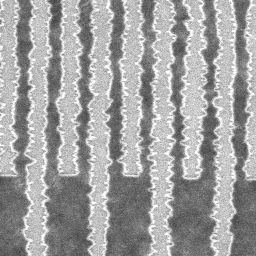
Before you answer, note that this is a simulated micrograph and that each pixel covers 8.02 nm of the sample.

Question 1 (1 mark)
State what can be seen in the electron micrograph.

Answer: parallel lines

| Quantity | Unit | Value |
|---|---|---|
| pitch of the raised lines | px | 31.1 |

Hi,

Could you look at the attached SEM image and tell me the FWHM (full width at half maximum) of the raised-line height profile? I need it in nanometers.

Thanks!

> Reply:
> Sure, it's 136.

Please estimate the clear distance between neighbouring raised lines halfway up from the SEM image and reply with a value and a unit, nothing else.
14.6 px